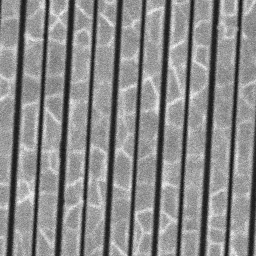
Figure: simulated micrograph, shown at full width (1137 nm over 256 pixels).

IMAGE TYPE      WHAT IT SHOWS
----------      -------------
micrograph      parallel lines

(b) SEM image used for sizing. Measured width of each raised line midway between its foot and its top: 82.6 nanometers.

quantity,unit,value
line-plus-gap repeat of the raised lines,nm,107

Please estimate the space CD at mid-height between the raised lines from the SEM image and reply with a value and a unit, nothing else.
26 nm